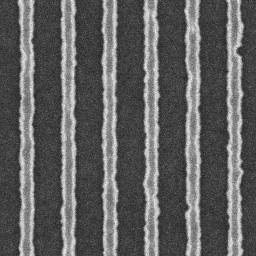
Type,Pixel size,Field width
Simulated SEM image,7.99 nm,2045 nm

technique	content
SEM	parallel lines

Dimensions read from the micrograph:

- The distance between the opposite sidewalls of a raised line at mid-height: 84.9 nanometres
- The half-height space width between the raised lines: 249 nanometres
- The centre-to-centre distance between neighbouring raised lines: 332 nanometers